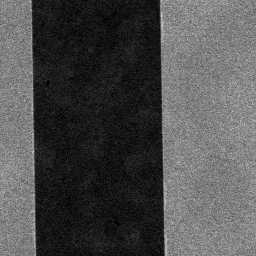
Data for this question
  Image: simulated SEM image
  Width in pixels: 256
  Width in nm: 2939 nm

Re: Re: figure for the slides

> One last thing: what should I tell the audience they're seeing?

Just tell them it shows one or a few lines or trenches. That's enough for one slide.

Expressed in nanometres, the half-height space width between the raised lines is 1490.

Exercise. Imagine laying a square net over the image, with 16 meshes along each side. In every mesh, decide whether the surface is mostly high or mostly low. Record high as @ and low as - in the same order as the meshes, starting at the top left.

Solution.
@@--------@@@@@@
@@--------@@@@@@
@@--------@@@@@@
@@--------@@@@@@
@@--------@@@@@@
@@--------@@@@@@
@@--------@@@@@@
@@--------@@@@@@
@@--------@@@@@@
@@--------@@@@@@
@@------@-@@@@@@
@@--------@@@@@@
@@--------@@@@@@
@@--------@@@@@@
@@--------@@@@@@
@@--------@@@@@@